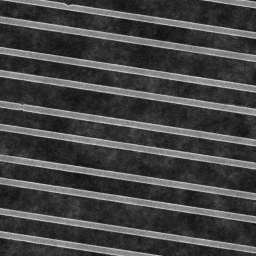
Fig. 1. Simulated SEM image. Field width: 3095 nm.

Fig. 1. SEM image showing parallel lines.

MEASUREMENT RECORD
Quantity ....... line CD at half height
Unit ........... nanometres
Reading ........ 73.2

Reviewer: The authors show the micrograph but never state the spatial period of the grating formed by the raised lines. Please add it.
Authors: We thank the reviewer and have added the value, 0.319 micrometres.